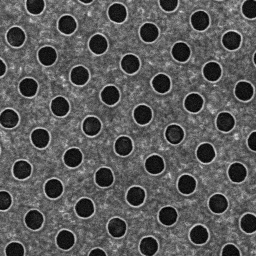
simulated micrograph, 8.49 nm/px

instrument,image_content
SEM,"a regular array of holes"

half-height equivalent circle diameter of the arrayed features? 167 nanometres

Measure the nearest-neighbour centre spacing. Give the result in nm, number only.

310